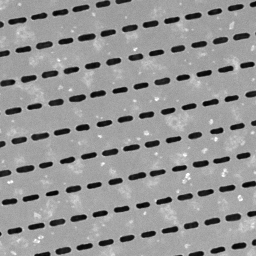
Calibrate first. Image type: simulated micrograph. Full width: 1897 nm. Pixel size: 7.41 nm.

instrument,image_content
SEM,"a regular array of holes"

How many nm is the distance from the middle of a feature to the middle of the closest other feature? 159